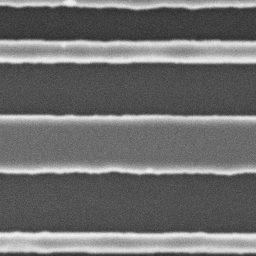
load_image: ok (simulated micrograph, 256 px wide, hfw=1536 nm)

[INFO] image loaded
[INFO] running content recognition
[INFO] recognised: lines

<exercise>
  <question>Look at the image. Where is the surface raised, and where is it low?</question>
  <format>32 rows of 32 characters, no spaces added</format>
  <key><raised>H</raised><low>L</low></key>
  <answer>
HHHHHHHHHHHHHHHHHHHHHHHHHHHHHHHH
LLLLLLLLLLLLLLLLLLLLLLLLLLLLLLLL
LLLLLLLLLLLLLLLLLLLLLLLLLLLLLLLL
LLLLLLLLLLLLLLLLLLLLLLLLLLLLLLLL
LLLLLLLLLLLLLLLLLLLLLLLLLLLLLLLL
HHHHHHHHHHHHHHHHHHHHHHHHHHHHHHHH
HHHHHHHHHHHHHHHHHHHHHHHHHHHHHHHH
HHHHHHHHHHHHHHHHHHHHHHHHHHHHHHHH
LLLLLLLLLLLLLLLLLLLLLLLLLLLLLLLL
LLLLLLLLLLLLLLLLLLLLLLLLLLLLLLLL
LLLLLLLLLLLLLLLLLLLLLLLLLLLLLLLL
LLLLLLLLLLLLLLLLLLLLLLLLLLLLLLLL
LLLLLLLLLLLLLLLLLLLLLLLLLLLLLLLL
LLLLLLLLLLLLLLLLLLLLLLLLLLLLLLLL
HHHHHHHLHHLLLHLHHLHHHHLLLLLLLLLL
HHHHHHHHHHHHHHHHHHHHHHHHHHHHHHHH
HHHHHHHHHHHHHHHHHHHHHHHHHHHHHHHH
HHHHHHHHHHHHHHHHHHHHHHHHHHHHHHHH
HHHHHHHHHHHHHHHHHHHHHHHHHHHHHHHH
HHHHHHHHHHHHHHHHHHHHHHHHHHHHHHHH
HHHHHHHHHHHHHHHHHHHHHHHHHHHHHHHH
LHHHHLLHLLLHHLLLHHHHHHHHHHHHHHHL
LLLLLLLLLLLLLLLLLLLLLLLLLLLLLLLL
LLLLLLLLLLLLLLLLLLLLLLLLLLLLLLLL
LLLLLLLLLLLLLLLLLLLLLLLLLLLLLLLL
LLLLLLLLLLLLLLLLLLLLLLLLLLLLLLLL
LLLLLLLLLLLLLLLLLLLLLLLLLLLLLLLL
LLLLLLLLLLLLLLLLLLLLLLLLLLLLLLLL
LLLLLLLLLLLLLLLLLLLLLLLLLLLLLLLL
HHHHHHHHHHHHHHHHHHHHHHHHHHHHHHHH
HHHHHHHHHHHHHHHHHHHHHHHHHHHHHHHH
LLLLLHLLLLLLLLLLLLLLLLLLLLLLLHHL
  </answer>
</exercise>